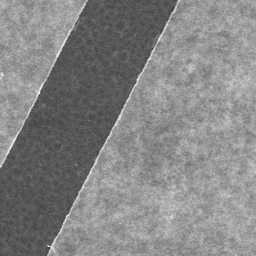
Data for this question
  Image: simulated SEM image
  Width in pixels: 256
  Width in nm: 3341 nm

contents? one or a few lines or trenches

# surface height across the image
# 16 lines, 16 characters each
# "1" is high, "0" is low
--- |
1111100000011111
1111100000111111
1111000001111111
1111000001111111
1110000001111111
1110000011111111
1100000011111111
1100000111111111
1000000111111111
1000001111111111
0000001111111111
0000011111111111
0000011111111111
0000111111111111
0000111111111111
0001111111111111